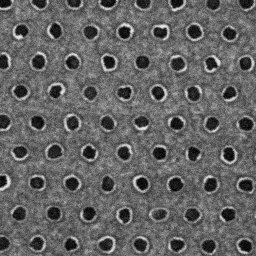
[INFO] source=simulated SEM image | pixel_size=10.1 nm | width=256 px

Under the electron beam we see a regular array of holes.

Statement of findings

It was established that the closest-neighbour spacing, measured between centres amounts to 342 nanometres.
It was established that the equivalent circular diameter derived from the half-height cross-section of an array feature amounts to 139 nm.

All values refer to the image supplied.